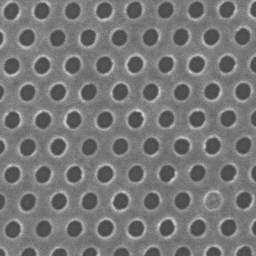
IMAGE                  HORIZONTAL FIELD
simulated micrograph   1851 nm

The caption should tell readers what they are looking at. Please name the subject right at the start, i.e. a regular array of holes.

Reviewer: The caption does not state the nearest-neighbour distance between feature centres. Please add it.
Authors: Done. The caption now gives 220 nanometres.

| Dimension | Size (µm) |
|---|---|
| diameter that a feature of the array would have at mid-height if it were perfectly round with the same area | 0.122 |